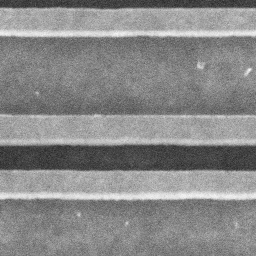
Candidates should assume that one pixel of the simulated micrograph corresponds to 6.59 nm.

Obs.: lines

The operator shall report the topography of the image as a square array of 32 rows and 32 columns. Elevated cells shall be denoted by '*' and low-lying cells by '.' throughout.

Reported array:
................................
********************************
********************************
********************************
................................
................................
................................
................................
................................
................................
................................
................................
................................
................................
**.........**...................
********************************
********************************
********************************
................................
................................
................................
********************************
********************************
********************************
********************************
................................
................................
................................
................................
................................
................................
................................